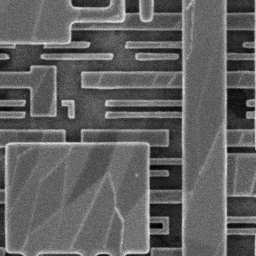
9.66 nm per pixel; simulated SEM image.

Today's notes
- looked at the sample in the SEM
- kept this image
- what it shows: wiring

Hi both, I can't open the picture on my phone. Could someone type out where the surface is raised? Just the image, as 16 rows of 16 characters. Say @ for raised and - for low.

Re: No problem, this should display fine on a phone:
@@@@@@@@-@-@@@--
@@@@@------@@@--
@@@@-------@@@--
-----------@@@--
-----------@@@--
-----------@@@--
-----------@@@--
-----------@@@--
-----------@@@--
@@@@@@@@@--@@@--
@@@@@@@@@--@@@--
@@@@@@@@@--@@@--
@@@@@@@@@--@@@--
@@@@@@@@@--@@@--
@@@@@@@@@--@@@--
@@@@@@@@@--@@@--